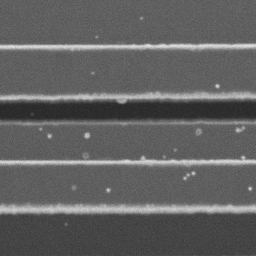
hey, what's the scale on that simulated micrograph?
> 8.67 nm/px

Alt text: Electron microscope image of lines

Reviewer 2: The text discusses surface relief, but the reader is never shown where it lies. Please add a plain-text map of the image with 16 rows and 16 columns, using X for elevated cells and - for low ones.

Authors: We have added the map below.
XXXXXXXXXXXXXXXX
XXXXXXXXXXXXXXXX
XXXXXXXXXXXXXXXX
XXXXXXXXXXXXXXXX
XXXXXXXXXXXXXXXX
XXXXXXXXXXXXXXXX
----------------
----------------
XXXXXXXXXXXXXXXX
XXXXXXXXXXXXXXXX
XXXXXXXXXXXXXXXX
XXXXXXXXXXXXXXXX
XXXXXXXXXXXXXXXX
----------------
----------------
----------------